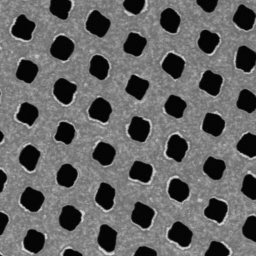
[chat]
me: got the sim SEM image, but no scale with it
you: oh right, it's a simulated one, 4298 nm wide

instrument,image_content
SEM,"a regular array of holes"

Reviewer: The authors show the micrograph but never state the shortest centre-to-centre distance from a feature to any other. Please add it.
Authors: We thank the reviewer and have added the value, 701 nanometers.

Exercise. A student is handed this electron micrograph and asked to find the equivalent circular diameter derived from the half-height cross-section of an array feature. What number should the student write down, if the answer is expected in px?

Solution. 22.5